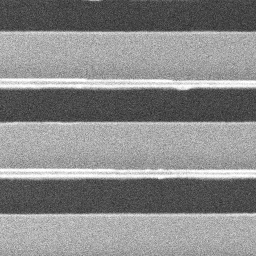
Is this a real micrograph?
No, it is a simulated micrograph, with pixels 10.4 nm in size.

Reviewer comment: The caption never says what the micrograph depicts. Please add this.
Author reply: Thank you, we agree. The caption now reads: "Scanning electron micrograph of lines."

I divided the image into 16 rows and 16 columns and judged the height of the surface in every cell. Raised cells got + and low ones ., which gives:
................
................
++++++++++++++++
++++++++++++++++
++++++++++++++++
...........+....
................
................
++++++++++++++++
++++++++++++++++
++++++++++++++++
................
................
++++++++++++++++
++++++++++++++++
++++++++++++++++